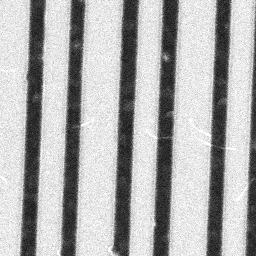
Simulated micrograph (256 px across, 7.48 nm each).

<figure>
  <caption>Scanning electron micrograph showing parallel lines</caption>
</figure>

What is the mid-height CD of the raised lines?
0.135 micrometres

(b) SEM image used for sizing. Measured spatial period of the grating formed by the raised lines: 347 nm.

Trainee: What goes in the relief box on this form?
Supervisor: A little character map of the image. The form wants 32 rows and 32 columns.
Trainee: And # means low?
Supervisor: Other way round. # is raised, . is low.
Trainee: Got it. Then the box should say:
....##...##....##...###....##...
....##...##....##...##.....##...
....##...##....##...##.....##...
....##...##....##...##.....##...
....##...##....##...##.....##...
...###..###....##...##.....##...
...###..###....##...##.....##...
...##...##.....##...##.....##...
...###..##.....##...##.....##...
...##...##.....##...##.....##..#
...###..##.....##...##.....##..#
...##...##.....##...##....###..#
...##...##.....##...##....###..#
...##...##.....##...##....###..#
...##...##.....##...##....###..#
...##...##.....##...##....##...#
...##...##.....##...##....##...#
...##...##.....##..###....##...#
...##...##.....##..###....##...#
...##...##....###..###....##...#
...##...##....###..###....##...#
...##...##....###..###....##...#
...##...##....###..###....##...#
...##...##....###..###....##...#
...##...##....###..###....##...#
...##...##....##...###....##...#
...##...##....##...##.....##...#
...##...##....##...##.....##...#
...##...##....##...##.....##...#
...##...##....##...##.....##...#
..###...##....##...##.....##...#
..###..###....##...##.....##...#